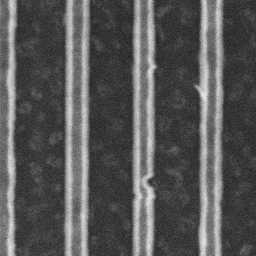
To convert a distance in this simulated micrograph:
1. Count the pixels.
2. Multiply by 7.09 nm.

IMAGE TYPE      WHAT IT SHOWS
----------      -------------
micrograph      one or a few lines or trenches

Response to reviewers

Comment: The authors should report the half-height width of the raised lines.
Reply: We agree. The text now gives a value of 117 nm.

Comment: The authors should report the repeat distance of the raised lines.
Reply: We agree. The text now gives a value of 474 nanometres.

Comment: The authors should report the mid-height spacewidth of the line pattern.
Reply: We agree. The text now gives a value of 0.364 micrometres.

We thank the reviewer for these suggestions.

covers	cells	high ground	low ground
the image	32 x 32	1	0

11000000011000000110000001100000
11000000011000000110000001100000
11000000011000000110000000100000
11000000011000000110000001100000
10000000011000000110000001100000
11000000011000000110000001100000
11000000011000000110000001100000
11000000011000000110000001100000
11000000011000000110000001100000
10000000011000000110000001100000
10000000011000000110000001100000
10000000011000000110000001100000
11000000011000000110000001100000
11000000011000000110000001100000
10000000011000000110000001100000
11000000011000000110000001100000
11000000011000000110000001100000
10000000011000000110000001100000
10000000011000000110000001100000
10000000011000000110000001100000
11000000011000000110000001100000
11000000011000000110000001100000
11000000011000000100000001100000
11000000011000000110000001100000
10000000011000000110000001100000
10000000011000000110000001100000
10000000011000000110000001100000
11000000011000000110000001100000
10000000111000000110000001100000
10000000011000000110000001100000
10000000011000000110000001100000
10000000011000000110000001100000